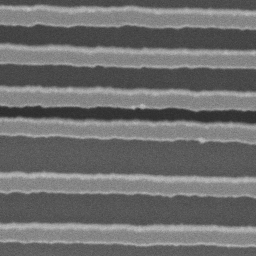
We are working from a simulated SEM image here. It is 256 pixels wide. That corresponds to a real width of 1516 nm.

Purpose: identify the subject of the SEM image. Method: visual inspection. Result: lines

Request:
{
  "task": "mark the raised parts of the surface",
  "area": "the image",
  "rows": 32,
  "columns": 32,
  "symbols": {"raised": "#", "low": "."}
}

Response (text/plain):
................................
################################
################################
............................####
................................
................................
################################
################################
...............................#
................................
................................
########################.####...
################################
................##.##..#########
................................
###############################.
################################
.....................#...#######
................................
................................
................................
................................
################################
################################
............................##.#
................................
................................
................................
#############################.##
################################
...............#################
................................